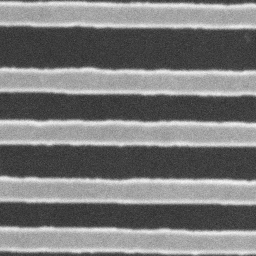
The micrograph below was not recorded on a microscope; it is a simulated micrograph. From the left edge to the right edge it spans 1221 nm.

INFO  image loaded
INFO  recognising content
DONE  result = lines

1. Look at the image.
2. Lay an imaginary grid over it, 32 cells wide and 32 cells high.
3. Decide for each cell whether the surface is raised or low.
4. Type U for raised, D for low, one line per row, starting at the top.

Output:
UUUUUUUUUUUUUUDDDUUDDDDDDDDDDDDD
UUUUUUUUUUUUUUUUUUUUUUUUUUUUUUUU
UUUUUUUUUUUUUUUUUUUUUUUUUUUUUUUU
DDDDDDDDDDDDDDDDDDDDDDDDDDDDDDDD
DDDDDDDDDDDDDDDDDDDDDDDDDDDDDDDD
DDDDDDDDDDDDDDDDDDDDDDDDDDDDDDDD
DDDDDDDDDDDDDDDDDDDDDDDDDDDDDDDD
DDDDDDDDDDDDDDDDDDDDDDDDDDDDDDDD
DDDDDDDDDDDDDDDDDDDDDDDDDDDDDDDD
UUUUUUUUUUUUUUUUUUUUUUUUUUUUUUUU
UUUUUUUUUUUUUUUUUUUUUUUUUUUUUUUU
DDDDDDUUUUUUUUUUUUUUUUUUUUUUUUUU
DDDDDDDDDDDDDDDDDDDDDDDDDDDDDDDD
DDDDDDDDDDDDDDDDDDDDDDDDDDDDDDDD
DDDDDDDDDDDDDDDDDDDDDDDDDDDDDDDD
UUUUUUUUUUUUUUUUUUUUUUUUUUUUUUUU
UUUUUUUUUUUUUUUUUUUUUUUUUUUUUUUU
UUUUUUUUUUUUUUUUUUUUUUUUUUUUUUUU
DDDDDDDDDDDDDDDDDDDDDDDDDDDDDDDD
DDDDDDDDDDDDDDDDDDDDDDDDDDDDDDDD
DDDDDDDDDDDDDDDDDDDDDDDDDDDDDDDD
DDDDDDDDDDDDDDDDDDDDDDDDDDDDDDDD
UUUUUUUUUUUDUDDDDUUDDDDDDDDDDDDD
UUUUUUUUUUUUUUUUUUUUUUUUUUUUUUUU
UUUUUUUUUUUUUUUUUUUUUUUUUUUUUUUU
DDDDDDDDDDDDDDDDDDDDDDDDDDDDDDDD
DDDDDDDDDDDDDDDDDDDDDDDDDDDDDDDD
DDDDDDDDDDDDDDDDDDDDDDDDDDDDDDDD
UUDDDUDDDDDDDDDDDDDDDDDDDDDDDDDD
UUUUUUUUUUUUUUUUUUUUUUUUUUUUUUUU
UUUUUUUUUUUUUUUUUUUUUUUUUUUUUUUU
DDDDDDDDDUDUDDDUUUUUUUUUUUUUUUUU